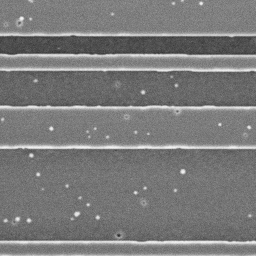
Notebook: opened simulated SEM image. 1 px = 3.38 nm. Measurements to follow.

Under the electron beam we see lines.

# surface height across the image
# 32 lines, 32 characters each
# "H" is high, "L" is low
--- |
HHHHHHHHHHHHHHHHHHHHHHHHHHHHHHHH
HHHHHHHHHHHHHHHHHHHHHHHHHHHHHHHH
HHHHHHHHHHHHHHHHHHHHHHHHHHHHHHHH
HHHHHHHHHHHHHHHHHHHHHHHHHHHHHHHH
LLLLLLLLLLLLLLLLLLLLLLLLLLLLLHLL
LLLLLLLLLLLLLLLLLLLLLLLLLLLLLLLL
LLLLLLLLLLLLLLLLLLLLLLLLLLLLLLLL
HHHHHHHHHHHHHHHHHHHHHHHHHHHHHHHH
HHHHHHHHHHHHHHHHHHHHHHHHHHHHHHHH
LLLLLLLLLLLLLLLLLLLLLLLLLLLLLLLL
LLLLLLLLLLLLLLLLLLLLLLLLLLLLLLLL
LLLLLLLLLLLLLLLLLLLLLLLLLLLLLLLL
LLLLLLLLLLLLLLLLLLLLLLLLLLLLLLLL
HHHHHHHHHHHHHHHHHHHHHHHHHHHHHHHH
HHHHHHHHHHHHHHHHHHHHHHHHHHHHHHHH
HHHHHHHHHHHHHHHHHHHHHHHHHHHHHHHH
HHHHHHHHHHHHHHHHHHHHHHHHHHHHHHHH
HHHHHHHHHHHHHHHHHHHHHHHHHHHHHHHH
HHHHHHHHHHHHHHHHHHHHHHHHHHHHHHHH
LLLLLLLLLLLLLLLLLLLLLLLLLLLLLLLL
LLLLLLLLLLLLLLLLLLLLLLLLLLLLLLLL
LLLLLLLLLLLLLLLLLLLLLLLLLLLLLLLL
LLLLLLLLLLLLLLLLLLLLLLLLLLLLLLLL
LLLLLLLLLLLLLLLLLLLLLLLLLLLLLLLL
LLLLLLLLLLLLLLLLLLLLLLLLLLLLLLLL
LLLLLLLLLLLLLLLLLLLLLLLLLLLLLLLL
LLLLLLLLLLLLLLLLLLLLLLLLLLLLLLLL
LLLLLLLLLLLLLLLLLLLLLLLLLLLLLLLL
LLLLLLLLLLLLLLLLLLLLLLLLLLLLLLLL
LLLLLLLLLLLLLLLLLLLLLLLLLLLLLLLL
HHHHHHHHHHHHHHHHHHHHHHHHHHHHHHHH
HHHHHHHHHHHHHHHHHHHHHHHHHHHHHHHH